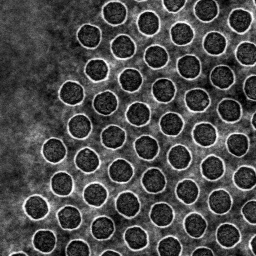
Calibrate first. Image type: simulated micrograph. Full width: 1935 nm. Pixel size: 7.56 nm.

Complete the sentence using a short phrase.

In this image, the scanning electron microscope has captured a regular array of holes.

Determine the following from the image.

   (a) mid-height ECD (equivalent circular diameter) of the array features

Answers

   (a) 178 nm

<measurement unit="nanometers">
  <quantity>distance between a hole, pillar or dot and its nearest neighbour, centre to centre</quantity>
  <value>258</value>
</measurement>